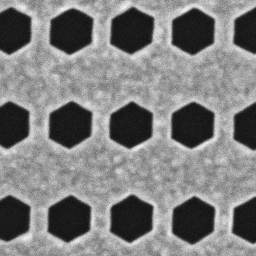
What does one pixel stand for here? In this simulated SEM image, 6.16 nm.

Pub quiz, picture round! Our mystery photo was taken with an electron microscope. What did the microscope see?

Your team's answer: a regular array of holes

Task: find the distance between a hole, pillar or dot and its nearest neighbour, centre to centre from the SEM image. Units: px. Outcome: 61.4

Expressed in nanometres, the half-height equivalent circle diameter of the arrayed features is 280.